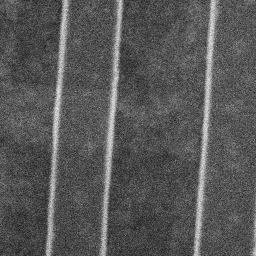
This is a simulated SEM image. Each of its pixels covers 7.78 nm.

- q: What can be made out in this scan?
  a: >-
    one or a few lines or trenches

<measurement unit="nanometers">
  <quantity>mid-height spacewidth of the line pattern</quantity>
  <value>727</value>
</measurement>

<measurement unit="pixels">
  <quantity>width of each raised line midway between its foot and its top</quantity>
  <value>55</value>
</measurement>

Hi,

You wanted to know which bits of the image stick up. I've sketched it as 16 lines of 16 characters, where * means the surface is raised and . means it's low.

....****.....***
....***......***
....***......***
....***......***
....***......***
....***......***
....***......***
...****......***
...****......***
...****......***
...****......***
...****......***
...****......***
...****.....****
...****.....****
...***......****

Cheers